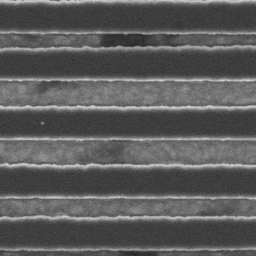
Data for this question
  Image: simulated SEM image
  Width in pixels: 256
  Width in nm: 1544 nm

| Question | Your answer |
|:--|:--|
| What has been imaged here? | lines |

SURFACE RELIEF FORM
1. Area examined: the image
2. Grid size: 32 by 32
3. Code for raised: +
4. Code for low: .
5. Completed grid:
++++++++++++++++++++++++++++++++
++++++++++++++++++++++++++++++++
++++++++++++++++++++++++++++++++
++++++++++++++++++++++++++++++++
................................
................................
++++++++++++++++++++++++++++++++
++++++++++++++++++++++++++++++++
++++++++++++++++++++++++++++++++
++++++++++++++++++++++++++++++++
................................
................................
................................
++++++++++++++++++++++++++++++++
++++++++++++++++++++++++++++++++
++++++++++++++++++++++++++++++++
++++++++++++++++++++++++++++++++
..........+.....++.........+....
................................
................................
+.++............................
++++++++++++++++++++++++++++++++
++++++++++++++++++++++++++++++++
++++++++++++++++++++++++++++++++
++++++++++++++++++++++++++++++++
................................
................................
++++++++++++++++++++++++++++++++
++++++++++++++++++++++++++++++++
++++++++++++++++++++++++++++++++
++++++++++++++++++++++++++++++++
................................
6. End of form